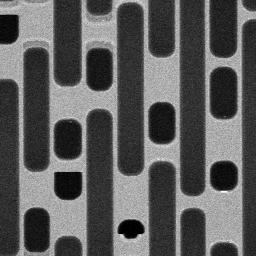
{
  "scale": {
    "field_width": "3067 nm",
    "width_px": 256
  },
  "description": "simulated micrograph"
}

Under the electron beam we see parallel lines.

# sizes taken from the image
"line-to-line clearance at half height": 295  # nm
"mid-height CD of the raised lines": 79.3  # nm